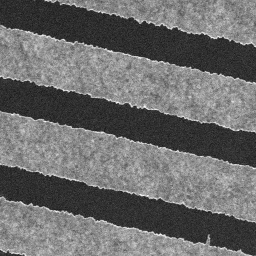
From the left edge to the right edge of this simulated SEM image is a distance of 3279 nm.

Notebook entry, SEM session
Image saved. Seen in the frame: one or a few lines or trenches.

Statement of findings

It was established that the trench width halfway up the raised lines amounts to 34.1 pixels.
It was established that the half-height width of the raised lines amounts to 647 nm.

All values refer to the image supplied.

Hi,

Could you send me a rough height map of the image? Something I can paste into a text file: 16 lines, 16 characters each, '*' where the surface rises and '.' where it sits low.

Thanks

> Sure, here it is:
.....***********
..........******
****..........**
********........
*************...
....************
........********
***.........****
*******.........
***********.....
.***************
.....***********
*.........******
*****.........**
*********.......
**************..